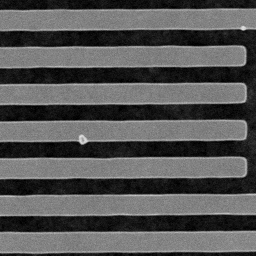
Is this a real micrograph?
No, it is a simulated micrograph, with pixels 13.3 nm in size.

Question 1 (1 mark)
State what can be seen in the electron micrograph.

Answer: groups of lines, slits or small figures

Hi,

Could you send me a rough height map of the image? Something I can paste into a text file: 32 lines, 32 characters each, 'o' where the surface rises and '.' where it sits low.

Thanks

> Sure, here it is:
................................
oooooooooooooooooooooooooooooooo
oooooooooooooooooooooooooooooooo
oooooooooooooooooooooooooooooooo
................................
................................
ooooooooooooooooooooooooooooooo.
ooooooooooooooooooooooooooooooo.
................................
................................
.............ooooooooooooooooo..
ooooooooooooooooooooooooooooooo.
ooooooooooooooooooooooooooooooo.
................................
................................
ooooooooooooooooooooooooooooooo.
ooooooooooooooooooooooooooooooo.
oooooooooooooooooooooo...oo.....
................................
................................
ooooooooooooooooooooooooooooooo.
ooooooooooooooooooooooooooooooo.
................................
................................
...ooooooooooooooooooooooooooooo
oooooooooooooooooooooooooooooooo
oooooooooooooooooooooooooooooooo
................................
................................
oooooooooooooooooooooooooooooooo
oooooooooooooooooooooooooooooooo
ooooooooooooo..oooo.............